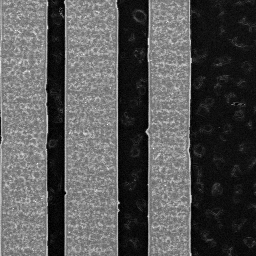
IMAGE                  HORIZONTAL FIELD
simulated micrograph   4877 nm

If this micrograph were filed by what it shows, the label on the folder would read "one or a few lines or trenches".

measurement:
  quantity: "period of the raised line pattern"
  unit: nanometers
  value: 1430